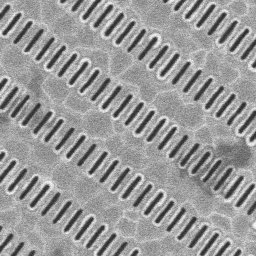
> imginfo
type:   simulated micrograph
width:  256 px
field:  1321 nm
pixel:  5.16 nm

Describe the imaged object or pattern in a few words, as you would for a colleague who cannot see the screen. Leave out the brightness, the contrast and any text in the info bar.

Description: a regular array of holes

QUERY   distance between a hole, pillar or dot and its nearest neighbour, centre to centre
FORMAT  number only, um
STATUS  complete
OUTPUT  0.0711